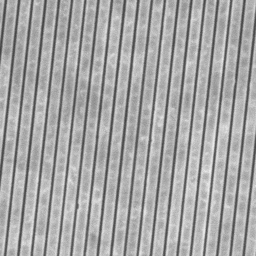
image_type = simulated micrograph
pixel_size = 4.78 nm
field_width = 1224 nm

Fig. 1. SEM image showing parallel lines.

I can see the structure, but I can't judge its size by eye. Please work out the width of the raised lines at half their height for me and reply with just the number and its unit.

0.0451 µm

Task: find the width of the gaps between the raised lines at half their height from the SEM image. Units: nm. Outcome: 17.8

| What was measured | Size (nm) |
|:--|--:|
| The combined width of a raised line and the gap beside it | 63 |